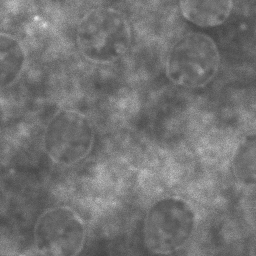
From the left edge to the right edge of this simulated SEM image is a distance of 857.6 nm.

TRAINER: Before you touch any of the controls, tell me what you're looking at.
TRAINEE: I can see raised bodies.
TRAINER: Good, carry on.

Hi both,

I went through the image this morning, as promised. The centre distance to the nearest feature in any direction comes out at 335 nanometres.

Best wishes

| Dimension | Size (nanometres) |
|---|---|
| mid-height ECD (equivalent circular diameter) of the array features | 179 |